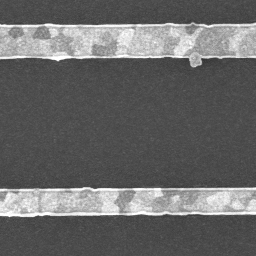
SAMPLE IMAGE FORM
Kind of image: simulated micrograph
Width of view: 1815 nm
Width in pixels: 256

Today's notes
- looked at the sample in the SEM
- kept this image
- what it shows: one or a few lines or trenches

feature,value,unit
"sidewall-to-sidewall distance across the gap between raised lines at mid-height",0.934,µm